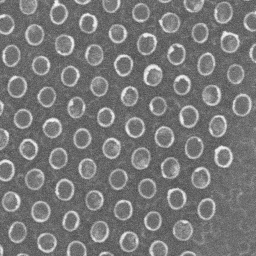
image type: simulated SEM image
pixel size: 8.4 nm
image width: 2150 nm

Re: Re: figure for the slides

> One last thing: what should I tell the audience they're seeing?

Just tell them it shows a regular array of raised bodies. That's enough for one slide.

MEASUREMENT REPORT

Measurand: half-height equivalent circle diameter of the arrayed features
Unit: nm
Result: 158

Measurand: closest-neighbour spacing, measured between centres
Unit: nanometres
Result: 258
